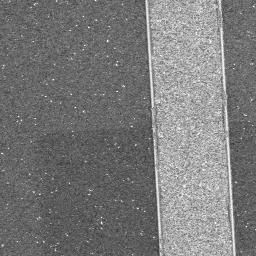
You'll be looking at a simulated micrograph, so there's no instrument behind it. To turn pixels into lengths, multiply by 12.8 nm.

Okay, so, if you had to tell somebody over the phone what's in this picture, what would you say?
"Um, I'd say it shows one or a few lines or trenches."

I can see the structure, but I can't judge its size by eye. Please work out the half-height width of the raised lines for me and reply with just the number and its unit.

0.941 microns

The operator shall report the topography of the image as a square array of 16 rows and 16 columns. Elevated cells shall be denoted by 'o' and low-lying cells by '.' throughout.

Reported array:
.........ooooo..
.........ooooo..
.........ooooo..
.........ooooo..
.........ooooo..
.........ooooo..
..........oooo..
..........oooo..
..........oooo..
..........oooo..
..........oooo..
..........oooo..
..........oooo..
..........ooooo.
..........ooooo.
..........ooooo.